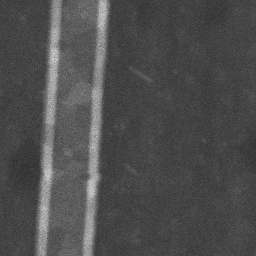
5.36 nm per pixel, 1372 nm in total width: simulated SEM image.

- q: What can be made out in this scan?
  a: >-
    one or a few lines or trenches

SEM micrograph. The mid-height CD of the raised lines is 244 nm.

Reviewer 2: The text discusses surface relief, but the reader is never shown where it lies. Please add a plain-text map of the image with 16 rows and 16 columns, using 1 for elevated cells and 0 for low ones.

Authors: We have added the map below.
0000110000000000
0001110000000000
0001110000000000
0001110000000000
0001110000000000
0001110000000000
0001110000000000
0001110000000000
0001110000000000
0001110000000000
0001110000000000
0001110000000000
0001110000000000
0001110000000000
0001110000000000
0001100000000000